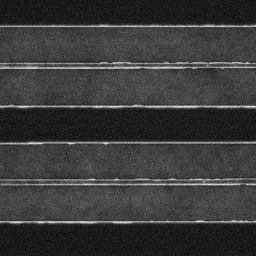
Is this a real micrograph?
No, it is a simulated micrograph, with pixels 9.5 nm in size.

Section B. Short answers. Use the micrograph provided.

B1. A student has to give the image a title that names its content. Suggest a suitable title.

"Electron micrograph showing lines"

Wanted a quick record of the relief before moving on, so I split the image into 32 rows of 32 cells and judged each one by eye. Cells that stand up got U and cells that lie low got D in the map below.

UUUUUUUUUUUUUUUUUUUUUUUUUUUUUUUU
UUUUUUUUUUUUUUUUUUUUUUUUUUUUUUUU
UUUUUUUUUUUUUUUUUUUUUUUUUUUUUUUU
DDDDDDDDDDDDDDDDDDDDDDDDDDDDDDDD
DDDDDDDDDDDDDDDDDDDDDDDDDDDDDDDD
DDDDDDDDDDDDDDDDDDDDDDDDDDDDDDDD
DDDDDDDDDDDDDDDDDDDDDDDDDDDDDDDD
DDDDDDDDDDDDDDDDDDDDDDDDDDDDDDDD
DDDDDDDDDDDDDDDDDDDDDDDDDDDDDDDD
DDDDDDDDDDDDDDDDDDDDDDDDDDDDDDDD
DDDDDDDDDDDDDDDDDDDDDDDDDDDDDDDD
DDDDDDDDDDDDDDDDDDDDDDDDDDDDDDDD
DDDDDDDDDDDDDDDDDDDDDDDDDDDDDDDD
UUUUUUUUUUUUUUUUUUUUUUUUUUUUUUUU
UUUUUUUUUUUUUUUUUUUUUUUUUUUUUUUU
UUUUUUUUUUUUUUUUUUUUUUUUUUUUUUUU
UUUUUUUUUUUUUUUUUUUUUUUUUUUUUUUU
UUUUUUUUUUUUUUUUUUUUUUUUUUUUUUUU
DDDDDDDDDDDDDDDDDDDDDDDDDDDDDDDD
DDDDDDDDDDDDDDDDDDDDDDDDDDDDDDDD
DDDDDDDDDDDDDDDDDDDDDDDDDDDDDDDD
DDDDDDDDDDDDDDDDDDDDDDDDDDDDDDDD
DDDDDDDDDDDDDDDDDUDDDDDDUDDUUUUU
DDDDDDDDDDDDDDDDDDDDDDDDDDDDDDDD
DDDDDDDDDDDDDDDDDDDDDDDDDDDDDDDD
DDDDDDDDDDDDDDDDDDDDDDDDDDDDDDDD
DDDDDDDDDDDDDDDDDDDDDDDDDDDDDDDD
DDDDDDDDDDDDDDDDDDDDDDDDDDDDDDDD
UUUUUUUUUUUUUUUUUUUUUUUUUUUUUUUU
UUUUUUUUUUUUUUUUUUUUUUUUUUUUUUUU
UUUUUUUUUUUUUUUUUUUUUUUUUUUUUUUU
UUUUUUUUUUUUUUUUUUUUUUUUUUUUUUUU